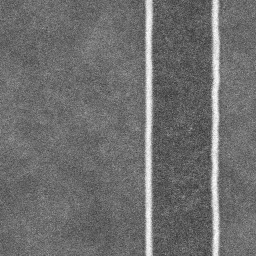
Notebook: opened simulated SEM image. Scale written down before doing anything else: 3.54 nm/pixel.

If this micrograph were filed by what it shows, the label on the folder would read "one or a few lines or trenches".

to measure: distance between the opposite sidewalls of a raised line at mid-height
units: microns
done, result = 0.239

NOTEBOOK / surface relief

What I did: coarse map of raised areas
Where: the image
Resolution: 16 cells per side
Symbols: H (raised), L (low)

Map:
LLLLLLLLLHHHHLLL
LLLLLLLLLHHHHLLL
LLLLLLLLLHHHHLLL
LLLLLLLLLHHHHHLL
LLLLLLLLLHHHHLLL
LLLLLLLLLHHHHLLL
LLLLLLLLLHHHHLLL
LLLLLLLLLHHHHLLL
LLLLLLLLLHHHHLLL
LLLLLLLLLHHHHLLL
LLLLLLLLLHHHHLLL
LLLLLLLLLHHHHLLL
LLLLLLLLLHHHHLLL
LLLLLLLLLHHHHLLL
LLLLLLLLLHHHHHLL
LLLLLLLLLHHHHHLL